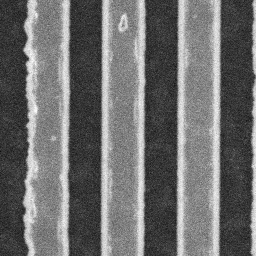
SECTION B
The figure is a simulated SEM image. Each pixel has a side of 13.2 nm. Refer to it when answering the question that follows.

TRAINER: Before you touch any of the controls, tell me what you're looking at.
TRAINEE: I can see one or a few lines or trenches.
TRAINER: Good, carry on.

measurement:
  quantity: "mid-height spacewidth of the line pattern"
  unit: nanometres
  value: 504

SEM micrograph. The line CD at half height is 0.492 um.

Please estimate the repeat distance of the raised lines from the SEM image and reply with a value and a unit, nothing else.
999 nanometers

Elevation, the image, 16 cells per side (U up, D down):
DDUUDDDUUDDUUUDD
DDUUDDDUUDDUUUDD
DDUUDDDUUDDUUUDD
DDUUDDDUUDDUUUDD
DDUUDDDUUDDUUUDD
DDUUDDDUUDDUUUDD
DDUUDDDUUDDUUUDD
DDUUDDDUUDDUUUDD
DDUUDDDUUDDUUUDD
DDUUDDDUUDDUUUDD
DDUUDDDUUDDUUUDD
DDUUDDDUUDDUUUDD
DDUUDDDUUDDUUUDD
DDUUDDUUUDDUUUDD
DDUUDDUUUDDUUDDD
DDUUDDUUUDDUUDDD